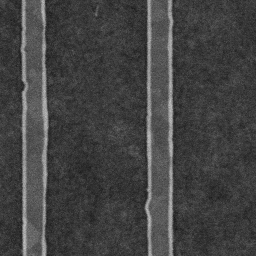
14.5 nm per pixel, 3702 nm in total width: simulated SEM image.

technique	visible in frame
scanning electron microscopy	one or a few lines or trenches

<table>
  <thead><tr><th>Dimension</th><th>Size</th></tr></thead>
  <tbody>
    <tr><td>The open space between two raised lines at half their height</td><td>1.51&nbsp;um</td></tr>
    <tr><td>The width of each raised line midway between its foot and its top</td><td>309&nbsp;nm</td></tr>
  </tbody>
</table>